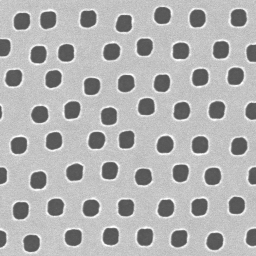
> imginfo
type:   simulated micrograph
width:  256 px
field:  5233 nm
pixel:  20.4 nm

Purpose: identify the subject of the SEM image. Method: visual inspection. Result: a regular array of holes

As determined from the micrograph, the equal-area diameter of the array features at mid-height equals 367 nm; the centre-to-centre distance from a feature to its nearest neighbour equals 664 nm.